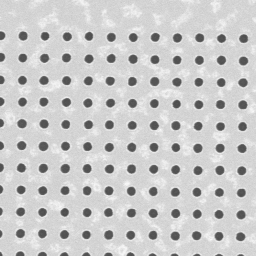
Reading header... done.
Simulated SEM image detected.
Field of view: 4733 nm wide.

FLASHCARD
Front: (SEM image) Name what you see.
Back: a regular array of holes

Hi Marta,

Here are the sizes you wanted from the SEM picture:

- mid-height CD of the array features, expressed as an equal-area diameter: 173 nm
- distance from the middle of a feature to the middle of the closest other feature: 401 nanometers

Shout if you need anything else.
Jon